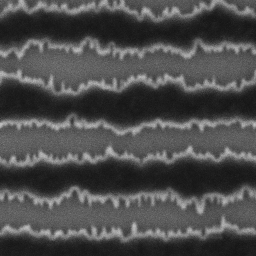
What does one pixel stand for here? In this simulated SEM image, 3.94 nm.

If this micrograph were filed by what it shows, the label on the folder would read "one or a few lines or trenches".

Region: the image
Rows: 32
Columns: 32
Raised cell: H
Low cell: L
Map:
LLHLLLLLLLLLLLHHLLLLLLLLLLHHLLLL
HHHHHHHHHHHHHHHHHHHLHHLLHHHHHHHH
HHHHHHHHHHHHHHHHHHHHHHHHHHHHHHHH
HHHHHHHHHHHHHHHHHHHHHHHHHHHHHHHH
HHHHHHHHHHHHHHHHHHHHHHHHHHHHHHHH
HHHHHLHHHHHLHHHHHHHHHHHHHHHHHHHH
HLHLLLLLLLLLHHHHHHLLLLHHLLLLLLLL
LLLLLLLLLLLLLLLLLLLLLLLLLLLLLLLL
LLLLLLLLLLLLLLLLLLLLLLLLLLLLLLLL
HHHLLLLLLLLLLLLLLLLLLLLLLLLLLLLL
HHHHHHHLLLLHHLLHHHHHHHHLLHHLLLHH
HHHHHHHHHHHHHHHHHHHHHHHHHHHHHHHH
HHHHHHHHHHHHHHHHHHHHHHHHHHHHHHHH
HHHHHHHHHHHHHHHHHHHHHHHHHHHHHHHH
HHHHHHHHHHHHHHHHHHHHHHHHHHHHHHHH
HLHHHHHHHHHHHHHHHHHHHHHHLHHLLLHH
LLLLLLLLLLLLLLHHLLLLLLLLLLLLLLLL
LLLLLLLLLLLLLLLLLLLLLLLLLLLLLLLL
LLLLLLLLLLLLLLLLLLLLLLLLLLLLLLLL
LLLLLHLLLLHLLHHHLLLHHLHHHHHLHHHH
HHHHHHHHHHHHHHHHHHHHHHHHHHHHHHHH
HHHHHHHHHHHHHHHHHHHHHHHHHHHHHHHH
HHHHHHHHHHHHHHHHHHHHHHHHHHHHHHHH
HHHHHHHHHHHHHHHHHHHHHHHHHHHHHHHH
HHHLHHHHHLHHHHHHHHHHHHHHHHHHHHLL
LLLLLLLLLLLLLLLLLLLLLLHHHHLLLLLL
LLLLLLLLLLLLLLLLLLLLLLLLLLLLLLLL
LLLLLLLLLLLLLLLLLLLLLLLLLLLLLLLL
LLLHLLLLLLLLLLLLLLLLLLLLLLLHHHLL
HHHHHHHHHHHHHHHLHHHHHHHHHHHHHHHH
HHHHHHHHHHHHHHHHHHHHHHHHHHHHHHHH
HHHHHHHHHHHHHHHHHHHHHHHHHHHHHHHH